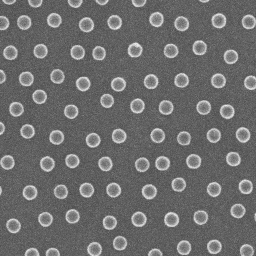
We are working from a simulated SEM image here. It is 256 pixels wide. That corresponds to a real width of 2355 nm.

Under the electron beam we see a regular array of raised bodies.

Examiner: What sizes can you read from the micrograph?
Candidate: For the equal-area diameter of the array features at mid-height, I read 126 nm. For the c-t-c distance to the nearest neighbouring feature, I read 247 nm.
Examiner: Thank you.